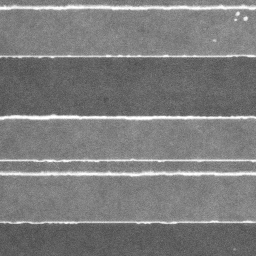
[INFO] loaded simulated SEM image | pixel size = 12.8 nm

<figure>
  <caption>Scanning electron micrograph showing lines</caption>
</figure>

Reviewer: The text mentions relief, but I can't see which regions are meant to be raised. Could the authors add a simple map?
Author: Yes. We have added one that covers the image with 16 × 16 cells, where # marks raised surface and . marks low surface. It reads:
################
################
################
################
................
................
................
################
################
################
################
################
################
################
................
................